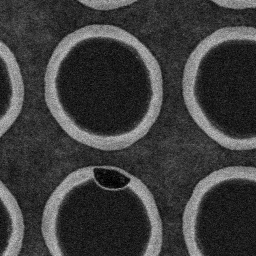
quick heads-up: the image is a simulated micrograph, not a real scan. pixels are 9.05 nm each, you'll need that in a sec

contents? raised bodies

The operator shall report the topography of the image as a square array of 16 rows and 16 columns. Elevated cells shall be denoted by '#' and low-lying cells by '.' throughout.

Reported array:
................
................
.....###.....###
....#####...####
#..#######..####
#..#######..####
#..#######..####
....#####....###
.....###.....###
................
................
....##.......###
...######...####
#..#######..####
#..#######..####
#..#######..####